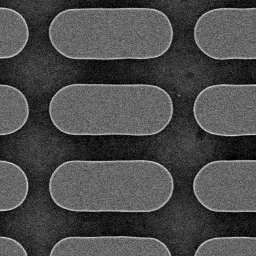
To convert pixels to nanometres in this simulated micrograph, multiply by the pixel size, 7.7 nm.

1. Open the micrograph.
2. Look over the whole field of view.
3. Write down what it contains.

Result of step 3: groups of lines, slits or small figures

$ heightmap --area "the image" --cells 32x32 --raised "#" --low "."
................................
##......############......######
###....##############....#######
###...###############...########
####..################..########
###....##############....#######
##.....##############....#######
................................
................................
................................
................................
##.....##############....#######
###...###############...########
####..###############...########
###...###############...########
###....##############....#######
##......############......######
................................
................................
................................
##......############......######
###....##############....#######
###...################..########
###...################..########
###...###############....#######
###....##############....#######
................................
................................
................................
................................
##.....##############....#######
###...###############....#######